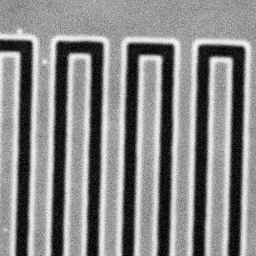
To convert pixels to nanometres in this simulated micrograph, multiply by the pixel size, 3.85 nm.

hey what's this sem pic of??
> groups of lines, slits or small figures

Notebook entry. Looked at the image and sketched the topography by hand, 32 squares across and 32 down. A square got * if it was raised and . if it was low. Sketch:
********************************
********************************
********************************
********************************
********************************
....***......***......***.....**
....***......***......**.......*
**..***..**..***..**..**...**..*
**..***..**..***..**..**..***..*
**..***..**..***.***..**..***..*
**..***..**..***.***..**..***..*
**..***..**..***.***..**..***..*
**..***..**..**..***..**..***..*
**..***..**..**..***..**..***..*
**..***..**..**..***..**..***..*
**..***..**..**..***..**..***..*
**..***..**..**..***..**..***..*
**..***.***..**..***..**..***..*
**..***.***..**..***..**..***..*
**..***.***..**..***..**..***..*
**..**..***..**..***..**..***..*
**..**..***..**..***..**..**...*
**..**..***..**..***..**..**...*
**..**..***..**..***..**..**..**
**..**..***..**..***..**..**..**
**..**..***..**..***..**..**..**
**..**..***..**..***.***..**..**
**..**..***..**..***.***..**..**
**..**..***..**..**..***..**..**
**..**..***..**..**..***..**..**
**..**..***..**..**..***..**..**
**..**..***..**..**..***..**..**